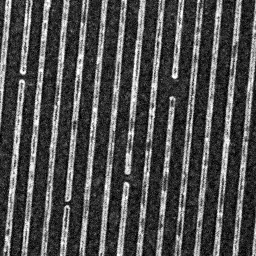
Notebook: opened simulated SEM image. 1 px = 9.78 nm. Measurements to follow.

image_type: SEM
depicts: parallel lines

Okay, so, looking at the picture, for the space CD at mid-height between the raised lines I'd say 136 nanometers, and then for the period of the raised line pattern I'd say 19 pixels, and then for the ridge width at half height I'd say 46.2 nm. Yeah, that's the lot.